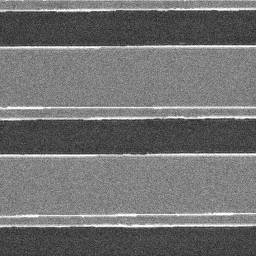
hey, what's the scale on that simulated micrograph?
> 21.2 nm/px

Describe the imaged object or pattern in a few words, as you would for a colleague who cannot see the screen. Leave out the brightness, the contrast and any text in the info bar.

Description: lines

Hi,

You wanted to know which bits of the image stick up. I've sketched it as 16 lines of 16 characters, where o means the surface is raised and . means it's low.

oooooooooooooooo
................
................
oooooooooooooooo
oooooooooooooooo
oooooooooooooooo
oooooooooooooooo
................
................
................
oooooooooooooooo
oooooooooooooooo
oooooooooooooooo
oooooooooooooooo
................
................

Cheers